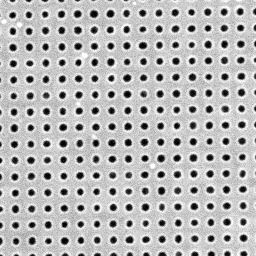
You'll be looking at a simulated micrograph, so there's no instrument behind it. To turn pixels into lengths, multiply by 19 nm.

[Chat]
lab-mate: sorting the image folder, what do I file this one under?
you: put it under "a regular array of holes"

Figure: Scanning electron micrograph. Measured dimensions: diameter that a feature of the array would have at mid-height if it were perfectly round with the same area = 159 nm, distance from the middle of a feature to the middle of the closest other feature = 0.304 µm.